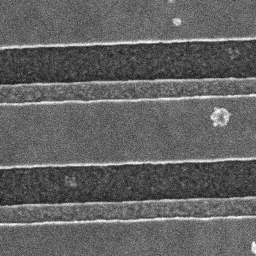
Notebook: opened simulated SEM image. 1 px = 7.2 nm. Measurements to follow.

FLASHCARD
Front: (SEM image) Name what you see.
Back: lines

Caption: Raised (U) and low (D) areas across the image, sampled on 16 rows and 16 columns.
UUUUUUUUUUUUUUUU
UUUUUUUUUUUUUUUU
UUUUUUUUUUUUUUDD
DDDDDDDDDDDDDDDD
DDDDDDDDDDDDDDDD
UUUUUUUUUUUUUUUU
UUUUUUUUUUUUUUUU
UUUUUUUUUUUUUUUU
UUUUUUUUUUUUUUUU
UUUUUUUUUUUUUUUU
UDDDDDDDDDDDDDDD
DDDDDDDDDDDDDDDD
DDDDDDDDDDUUUUUU
UUUUUUUUUUUUUUUU
UUUUUUUUUUUUUUUU
UUUUUUUUUUUUUUUU